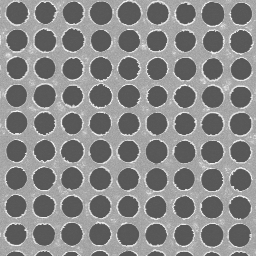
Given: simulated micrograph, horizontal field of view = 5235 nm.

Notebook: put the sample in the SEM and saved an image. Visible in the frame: a regular array of holes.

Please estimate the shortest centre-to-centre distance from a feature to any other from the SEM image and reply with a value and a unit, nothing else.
561 nm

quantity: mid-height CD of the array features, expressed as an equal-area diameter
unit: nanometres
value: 446